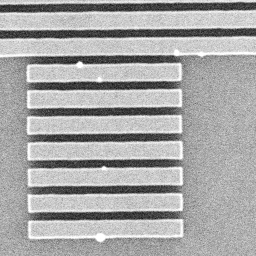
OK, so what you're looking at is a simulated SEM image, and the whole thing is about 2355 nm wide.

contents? groups of lines, slits or small figures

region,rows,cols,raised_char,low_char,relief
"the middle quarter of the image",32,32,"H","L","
HHHHHHHHHHHHHHHHHHHHHHHHHHHHHLLL
HHHHHHHHHHHHHHHHHHHHHHHHHHHHHLLL
HHHHHHHHHHHHHHHHHHHHHHHHHHHHHLLL
HHHHHHHHHHHHHHHHHHHHHHHHHHHHHLLL
LLLLLLLLLLLLLLLLLLLLLLLLLLLLLLLL
LLLLLLLLLLLLLLLLLLLLLLLLLLLLLLLL
LLLLLLLLLLLLLLLLLLLLLLLLLLLLLLLL
HHHHHHHHHHHHHHHHHHHHHHHHHHHHHLLL
HHHHHHHHHHHHHHHHHHHHHHHHHHHHHLLL
HHHHHHHHHHHHHHHHHHHHHHHHHHHHHLLL
HHHHHHHHHHHHHHHHHHHHHHHHHHHHHLLL
LLLLLLLLLLLLLLLLLLLLLLLLLLLLLLLL
LLLLLLLLLLLLLLLLLLLLLLLLLLLLLLLL
HHHHHHHHHHHHHHHHHHHHHHHHHHHHHLLL
HHHHHHHHHHHHHHHHHHHHHHHHHHHHHLLL
HHHHHHHHHHHHHHHHHHHHHHHHHHHHHLLL
HHHHHHHHHHHHHHHHHHHHHHHHHHHHHLLL
LLLLLLLLLLLLLLLLLLLLLLLLLLLLLLLL
LLLLLLLLLLLLLLLLLLLLLLLLLLLLLLLL
LLLLLLLLLLLLLLLLLLLLLLLLLLLLLLLL
HHHHHHHHHHHHHHHHHHHHHHHHHHHHHLLL
HHHHHHHHHHHHHHHHHHHHHHHHHHHHHLLL
HHHHHHHHHHHHHHHHHHHHHHHHHHHHHLLL
HHHHHHHHHHHHHHHHHHHHHHHHHHHHHLLL
LLLLLLLLLLLLLLLLLLLLLLLLLLLLLLLL
LLLLLLLLLLLLLLLLLLLLLLLLLLLLLLLL
HHHHHHHHHHHHHHHHHHHHHHHHHHHHHLLL
HHHHHHHHHHHHHHHHHHHHHHHHHHHHHLLL
HHHHHHHHHHHHHHHHHHHHHHHHHHHHHLLL
HHHHHHHHHHHHHHHHHHHHHHHHHHHHHLLL
LLLLLLLLLLLLLLLLLLLLLLLLLLLLLLLL
LLLLLLLLLLLLLLLLLLLLLLLLLLLLLLLL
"